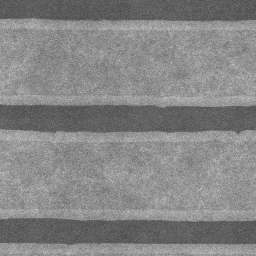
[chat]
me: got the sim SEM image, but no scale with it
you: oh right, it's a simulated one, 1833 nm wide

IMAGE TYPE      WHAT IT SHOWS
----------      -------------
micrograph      one or a few lines or trenches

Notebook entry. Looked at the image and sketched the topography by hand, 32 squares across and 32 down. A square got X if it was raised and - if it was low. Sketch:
--------------------------------
--------------------------------
--------------------------------
XXXXXXXXXXXXXXXXXXXXXXXXXXXXXXXX
XXXXXXXXXXXXXXXXXXXXXXXXXXXXXXXX
XXXXXXXXXXXXXXXXXXXXXXXXXXXXXXXX
XXXXXXXXXXXXXXXXXXXXXXXXXXXXXXXX
XXXXXXXXXXXXXXXXXXXXXXXXXXXXXXXX
XXXXXXXXXXXXXXXXXXXXXXXXXXXXXXXX
XXXXXXXXXXXXXXXXXXXXXXXXXXXXXXXX
XXXXXXXXXXXXXXXXXXXXXXXXXXXXXXXX
XXXXXXXXXXXXXXXXXXXXXXXXXXXXXXXX
-----XXXXXXXXXXXXXXXXXXXXXXXXXXX
--------------------------------
--------------------------------
--------------------------------
--------------------------------
XXXXXXXXXXXXXXXXXXXXXXXXXXXXXXXX
XXXXXXXXXXXXXXXXXXXXXXXXXXXXXXXX
XXXXXXXXXXXXXXXXXXXXXXXXXXXXXXXX
XXXXXXXXXXXXXXXXXXXXXXXXXXXXXXXX
XXXXXXXXXXXXXXXXXXXXXXXXXXXXXXXX
XXXXXXXXXXXXXXXXXXXXXXXXXXXXXXXX
XXXXXXXXXXXXXXXXXXXXXXXXXXXXXXXX
XXXXXXXXXXXXXXXXXXXXXXXXXXXXXXXX
XXXXXXXXXXXXXXXXXXXXXXXXXXXXXXXX
XXXXXXXXXXXXXXXXXXXXXXXXXXXXXXXX
--------------------------------
--------------------------------
--------------------------------
--------------------------------
XXXXXXXXXXXXXXXXXXXXXXXXXXXXXXXX